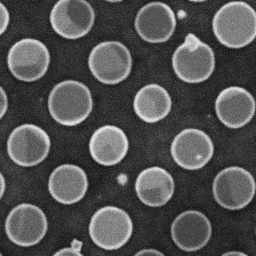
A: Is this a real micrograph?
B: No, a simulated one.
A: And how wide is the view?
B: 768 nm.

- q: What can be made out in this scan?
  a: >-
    a regular array of raised bodies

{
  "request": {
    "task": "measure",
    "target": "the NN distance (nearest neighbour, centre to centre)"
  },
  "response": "171 nanometers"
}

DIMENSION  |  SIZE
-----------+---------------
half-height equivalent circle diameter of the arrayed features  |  119 nanometers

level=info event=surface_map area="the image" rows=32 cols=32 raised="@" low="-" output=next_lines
-------@@@@--------@---------@@-
@------@@@@@-----@@@@------@@@@@
@-----@@@@@@-----@@@@@-----@@@@@
@------@@@@------@@@@@-----@@@@@
--------@@--------@@@------@@@@@
--@@@--------@@--------@@---@@@-
-@@@@@------@@@@------@@@@------
-@@@@@-----@@@@@------@@@@@-----
-@@@@@-----@@@@@------@@@@@-----
--@@@-------@@@@------@@@@------
--------@@----------------------
-------@@@@-------@@@-------@@@-
@-----@@@@@------@@@@------@@@@@
@-----@@@@@------@@@@------@@@@@
-------@@@@-------@@-------@@@@-
--------@-------------------@@--
--@@@-------@@@--------@@-------
-@@@@@-----@@@@@------@@@@------
-@@@@@-----@@@@@------@@@@------
-@@@@@------@@@-------@@@@------
---@---------@--------@@@@------
-------@@@--------@@@-------@@@-
------@@@@@------@@@@------@@@@@
------@@@@@------@@@@@-----@@@@@
-------@@@-------@@@@------@@@@@
------------------@@--------@@@-
--@@@-------@@@--------@--------
-@@@@@------@@@@------@@@@------
-@@@@@-----@@@@@------@@@@------
-@@@@------@@@@@------@@@@------
--@@-----@--@@@-------@@@@------
-------@@@--------@@------------